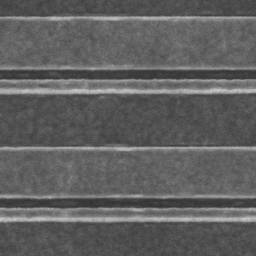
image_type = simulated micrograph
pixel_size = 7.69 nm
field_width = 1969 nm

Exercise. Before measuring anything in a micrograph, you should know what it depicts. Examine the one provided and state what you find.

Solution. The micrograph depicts lines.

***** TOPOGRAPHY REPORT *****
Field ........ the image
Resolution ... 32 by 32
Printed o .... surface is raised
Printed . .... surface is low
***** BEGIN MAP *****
................................
................................
oooooooooooooooooooooooooooooooo
oooooooooooooooooooooooooooooooo
oooooooooooooooooooooooooooooooo
oooooooooooooooooooooooooooooooo
oooooooooooooooooooooooooooooooo
oooooooooooooooooooooooooooooooo
oooooooooooooooooooooooooooooooo
oooooooooooooooooooooooooooooooo
oooooooooooooooooooooooooooooooo
................................
................................
................................
................................
................................
................................
................................
................................
oooooooooooooooooooooooooooooooo
oooooooooooooooooooooooooooooooo
oooooooooooooooooooooooooooooooo
oooooooooooooooooooooooooooooooo
oooooooooooooooooooooooooooooooo
oooooooooooooooooooooooooooooooo
oooooooooooooooooooooooooooooooo
oooooooooooooooooooooooooooooooo
................................
................................
................................
................................
................................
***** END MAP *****